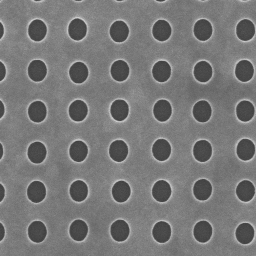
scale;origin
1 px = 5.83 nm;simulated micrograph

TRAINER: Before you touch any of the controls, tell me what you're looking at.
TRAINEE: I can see a regular array of holes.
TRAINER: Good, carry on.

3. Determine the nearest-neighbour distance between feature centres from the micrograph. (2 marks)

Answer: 230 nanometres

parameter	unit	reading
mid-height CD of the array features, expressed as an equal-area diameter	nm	123